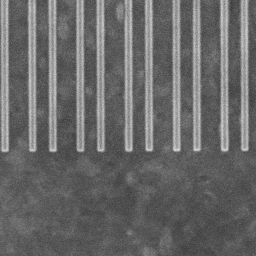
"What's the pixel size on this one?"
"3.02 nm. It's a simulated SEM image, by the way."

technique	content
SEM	parallel lines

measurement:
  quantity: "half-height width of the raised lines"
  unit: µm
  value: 0.0177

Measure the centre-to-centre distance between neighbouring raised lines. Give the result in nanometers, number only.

72.4